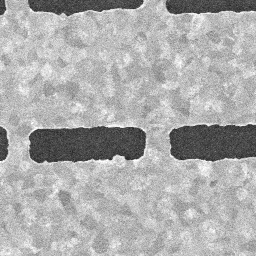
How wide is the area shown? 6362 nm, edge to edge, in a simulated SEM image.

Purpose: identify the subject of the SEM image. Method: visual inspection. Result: holes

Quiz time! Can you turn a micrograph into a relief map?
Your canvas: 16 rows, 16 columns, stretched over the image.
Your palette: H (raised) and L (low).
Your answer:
HHLLLLLLLHLLLLLL
HHHHHHHHHHHHHHHH
HHHHHHHHHHHHHHHH
HHHHHHHHHHHHHHHH
HHHHHHHHHHHHHHHH
HHHHHHHHHHHHHHHH
HHHHHHHHHHHHHHHH
HHHHHHHHHHHHHHHH
HHLLLLLLLHHLLLLL
HHLLLLLLLHHLLLLL
HHHHHHHHHHHHHHHH
HHHHHHHHHHHHHHHH
HHHHHHHHHHHHHHHH
HHHHHHHHHHHHHHHH
HHHHHHHHHHHHHHHH
HHHHHHHHHHHHHHHH